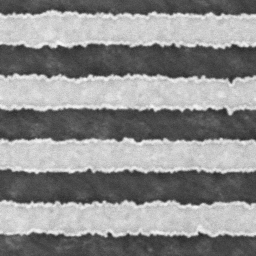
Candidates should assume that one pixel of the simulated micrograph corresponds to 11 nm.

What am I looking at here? one or a few lines or trenches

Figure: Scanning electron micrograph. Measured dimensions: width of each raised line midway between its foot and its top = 338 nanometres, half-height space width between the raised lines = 357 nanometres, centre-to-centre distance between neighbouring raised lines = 692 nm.